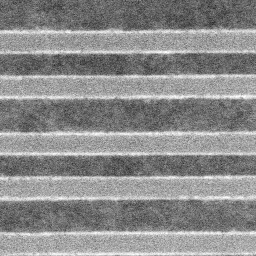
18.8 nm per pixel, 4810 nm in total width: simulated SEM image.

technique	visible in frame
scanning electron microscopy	lines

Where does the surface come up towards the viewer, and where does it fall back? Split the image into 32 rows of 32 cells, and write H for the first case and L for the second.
HHHHHHHHHHHHHHHHHHHHHHHHHHHHHHHH
HHHHHHHHHHHHHHHHHHHHHHHHHHHHHHHH
HHHHHHHHHHHHHHHHHHHHHHHHHHHHHHHH
HHHHHHHHHHHHHHHHHHHHHHHHHHHHHHHH
LLLLLLLLLLLLLLLLLLLLLLLLLLLLLLLL
LLLLLLLLLLLLLLLLLLLLLLLLLLLLLLLL
LLLLLLLLLLLLLLLLLLLLLLLLLLLLLLHH
HHHHHHHHHHHHHHHHHHHHHHHHHHHHHHHH
HHHHHHHHHHHHHHHHHHHHHHHHHHHHHHHH
HHHHHHHHHHHHHHHHHHHHHHHHHHHLLLLL
LLLLLLLLLLLLLLLLLLLLLLLLLLLLLLLL
LLLLLLLLLLLLLLLLLLLLLLLLLLLLLLLL
HHHHHHHHHHHHHHHHHHHHHHHHHHHHHHHH
HHHHHHHHHHHHHHHHHHHHHHHHHHHHHHHH
HHHHHHHHHHHHHHHHHHHHHHHHHHHHHHHH
HHHHHHHHHHHHHHHHHHHHHHHHHHHHHHHH
HHHHHHHHHHHHHHHHHHHHHHHHHHHHHHHH
LLLLLLLLLLLLLLLLLLLLLLLLLLLLLLLL
LLLLLLLLLLLLLLLLLLLLLLLLLLLLLLLL
HHHHHHHHHHHHHHHHHHHHHHHHHHHHHHHH
HHHHHHHHHHHHHHHHHHHHHHHHHHHHHHHH
HHHHHHHHHHHHHHHHHHHHHHHHHHHHHHHH
LLLLLLLLLLLLLLLLLLLLLLLLLLLLLLLL
LLLLLLLLLLLLLLLLLLLLLLLLLLLLLLLL
LLLLLLLLLLLLLLLLLLLLLLLLLLLLLLLL
HHHHHHHHHHHHHHHHHHHHHHHHHHHHHHHH
HHHHHHHHHHHHHHHHHHHHHHHHHHHHHHHH
HHHHHHHHHHHHHHHHHHHHHHHHHHHHHHHH
HHHHHHHHHHHHHHHHHHHHHHHHHHHHHHHH
LLLLLLLLLLLLLLLLLLLLLLLLLLLLLLLL
LLLLLLLLLLLLLLLLLLLLLLLLLLLLLLLL
LLLLLLLLLLLLLLLLLLLLLLLLLLLLLLLL